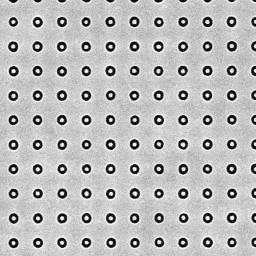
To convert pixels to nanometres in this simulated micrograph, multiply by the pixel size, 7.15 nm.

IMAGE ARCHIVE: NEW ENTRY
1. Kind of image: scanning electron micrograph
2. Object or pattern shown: a regular array of ring-shaped grooves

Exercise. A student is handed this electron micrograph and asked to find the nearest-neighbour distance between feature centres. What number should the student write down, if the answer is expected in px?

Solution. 24.1